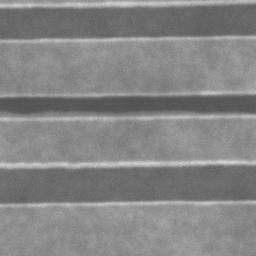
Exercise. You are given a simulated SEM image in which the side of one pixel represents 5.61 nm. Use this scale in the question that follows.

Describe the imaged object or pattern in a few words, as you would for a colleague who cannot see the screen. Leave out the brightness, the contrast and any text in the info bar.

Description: lines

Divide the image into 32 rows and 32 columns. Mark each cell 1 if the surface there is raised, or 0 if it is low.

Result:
11111111111111110000000000000000
00000000000000000000000000000000
00000000000000000000000000000000
00000000000000000000000000000000
00000000000000000000000000000000
11111111111111111111111111111111
11111111111111111111111111111111
11111111111111111111111111111111
11111111111111111111111111111111
11111111111111111111111111111111
11111111111111111111111111111111
11111111111111111111111111111111
00000000000000000000000000000000
00000000000000000000000000000000
00000000000000000111111111111111
11111111111111111111111111111111
11111111111111111111111111111111
11111111111111111111111111111111
11111111111111111111111111111111
11111111111111111111111111111111
11111111111111111111100000000000
00000000000000000000000000000000
00000000000000000000000000000000
00000000000000000000000000000000
00000000000000000000000000000000
00000000000011111111111111111111
11111111111111111111111111111111
11111111111111111111111111111111
11111111111111111111111111111111
11111111111111111111111111111111
11111111111111111111111111111111
11111111111111111111111111111111